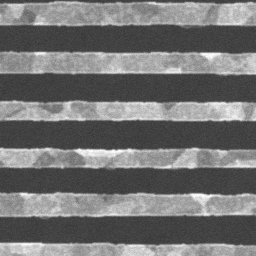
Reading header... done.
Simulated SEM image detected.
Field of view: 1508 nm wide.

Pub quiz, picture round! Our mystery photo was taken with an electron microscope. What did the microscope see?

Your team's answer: lines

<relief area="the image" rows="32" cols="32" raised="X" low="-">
------XXXX----X--XXX---X-------X
XXXXXXXXXXXXXXXXXXXXXXXXXXXXXXXX
XXXXXXXXXXXXXXXXXXXXXXXXXXXXXXXX
--------------------------------
--------------------------------
--------------------------------
--------------------------------
XXXXXXXXXXXXXXXXXXXXXXXXXXXXXXXX
XXXXXXXXXXXXXXXXXXXXXXXXXXXXXXXX
--------------------------------
--------------------------------
--------------------------------
--------------------------------
XXXXXXXXXXXXXXXXXXXXXXXXXXXXXXXX
XXXXXXXXXXXXXXXXXXXXXXXXXXXXXXXX
--------------------------------
--------------------------------
--------------------------------
--------------------------------
XXXXXXXXXXXXXXXXXXXXXXXXXXXXXXXX
XXXXXXXXXXXXXXXXXXXXXXXXXXXXXXXX
--------------------------------
--------------------------------
--------------------------------
XXXX-X-XXXXXXXXXXXXX-XXXXXXX-XXX
XXXXXXXXXXXXXXXXXXXXXXXXXXXXXXXX
XXXXXXXXXXXXXXXXXXXXXXXXXXXXXXXX
--------------------------------
--------------------------------
--------------------------------
--------------------------------
XXXXXXXXXXXXXXXXXXXXXXXXXXXXXXXX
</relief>